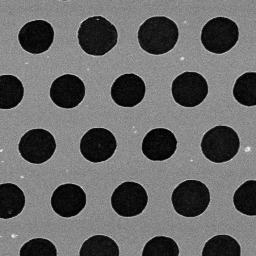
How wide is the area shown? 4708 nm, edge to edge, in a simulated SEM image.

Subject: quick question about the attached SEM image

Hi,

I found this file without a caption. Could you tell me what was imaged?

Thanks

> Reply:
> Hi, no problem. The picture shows a regular array of holes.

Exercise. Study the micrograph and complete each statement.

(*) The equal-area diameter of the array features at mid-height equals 665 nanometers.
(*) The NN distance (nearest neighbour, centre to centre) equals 1120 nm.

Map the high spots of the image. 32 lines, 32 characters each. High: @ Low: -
@@@@@@@@@@@@@@@@@@@@@@@@@@@@@@@@
@@@@@@@@@@@@@@@@@@@@@@@@@@@@@@@@
@@@@@@@@@@@--@@@@@---@@@@@---@@@
@@@----@@@----@@@-----@@@-----@@
@@-----@@@-----@@-----@@@-----@@
@@----@@@@----@@@-----@@@----@@@
@@@---@@@@@--@@@@@---@@@@@--@@@@
@@@@@@@@@@@@@@@@@@@@@@@@@@@@@@@@
@@@@@@@@@@@@@@@@@@@@@@@@@@@@@@@@
--@@@@@@--@@@@@--@@@@@---@@@@@--
---@@@@----@@@----@@@@----@@@---
---@@@-----@@@----@@@@----@@@---
---@@@----@@@@----@@@@---@@@@---
--@@@@@@-@@@@@@@@@@@@@@@@@@@@@@@
@@@@@@@@@@@@@@@@@@@@@@@@@@@@@@@@
@@@@@@@@@@@@@@@@@@@@@@@@@@@@@@@@
@@@---@@@@@---@@@@@--@@@@@---@@@
@@-----@@@----@@@@----@@@-----@@
@@-----@@@----@@@@----@@@-----@@
@@@----@@@----@@@@---@@@@@---@@@
@@@@-@@@@@@@@@@@@@@@@@@@@@@@@@@@
@@@@@@@@@@@@@@@@@@@@@@@@@@@@@@@@
@@@@@@@@@@@@@@@@@@@@@@@@@@@@@@@@
--@@@@@---@@@@@---@@@@----@@@@--
---@@@@----@@@----@@@-----@@@---
---@@@-----@@@----@@@@----@@@---
---@@@@---@@@@----@@@@---@@@@@--
@@@@@@@@@@@@@@@@@@@@@@@@@@@@@@@@
@@@@@@@@@@@@@@@@@@@@@@@@@@@@@@@@
@@@@@@@@@@@@-@@@@@@@@@@@@@@--@@@
@@@---@@@@----@@@@----@@@@----@@
@@@----@@@-----@@@----@@@-----@@